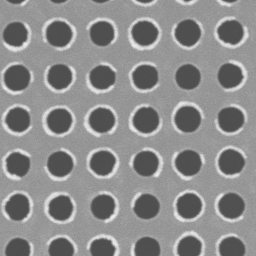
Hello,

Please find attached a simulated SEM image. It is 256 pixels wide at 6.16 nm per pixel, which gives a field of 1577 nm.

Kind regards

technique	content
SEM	a regular array of holes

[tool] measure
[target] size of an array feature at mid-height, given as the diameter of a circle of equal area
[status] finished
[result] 158 nm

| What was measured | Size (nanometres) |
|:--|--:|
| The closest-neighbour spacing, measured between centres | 261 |